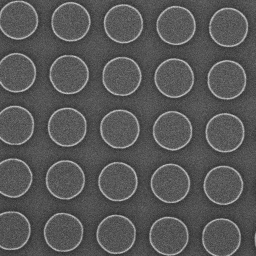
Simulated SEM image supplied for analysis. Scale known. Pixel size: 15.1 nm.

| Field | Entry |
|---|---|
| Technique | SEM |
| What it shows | an array of small figures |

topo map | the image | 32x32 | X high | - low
-XXX----XX----------------------
XXXX---XXXX---XXX---XXXX---XXX--
XXXXX--XXXX--XXXXX--XXXX--XXXXX-
XXXX---XXXX--XXXXX--XXXX--XXXXX-
-XXX---XXX----XXX---XXXX--XXXXX-
---------------------XX----XXX--
--------------------------------
XXXX---XXX----XX-----XX---------
XXXX--XXXXX--XXXX---XXXX--XXXX--
XXXX--XXXXX--XXXXX-XXXXX--XXXXX-
XXXX---XXXX--XXXX---XXXX--XXXXX-
--------XX----XXX---XXX----XXX--
--------------------------------
-XX-----------------------------
XXXX--XXXX---XXXX---XXX----XX---
XXXX--XXXXX--XXXX--XXXXX--XXXX--
XXXX--XXXXX--XXXX--XXXXX--XXXX--
XXX----XXX---XXXX--XXXXX--XXXX--
---------------------XX----XXX--
--------------------------------
XXX----XX-----XX----------------
XXXX--XXXX---XXXX--XXXX---XXXX--
XXXX--XXXXX-XXXXX--XXXXX--XXXX--
XXXX--XXXX--XXXXX--XXXXX--XXXX--
-X-----XX----XXX----XXX---XXXX--
---------------------------X----
--------------------------------
XXX---XXXX---XXX----XX-----X----
XXXX--XXXX--XXXXX--XXXX---XXXX--
XXXX--XXXX--XXXXX--XXXX--XXXXX--
XXX---XXXX--XXXXX--XXXX--XXXXX--
--------------XX----XX----XXX---